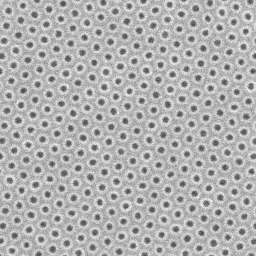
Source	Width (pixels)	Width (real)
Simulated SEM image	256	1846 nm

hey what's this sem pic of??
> a regular array of holes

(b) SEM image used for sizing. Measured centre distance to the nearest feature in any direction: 14.9 pixels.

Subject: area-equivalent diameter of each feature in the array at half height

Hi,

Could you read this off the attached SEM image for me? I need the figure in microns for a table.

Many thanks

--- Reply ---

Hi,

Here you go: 0.0546